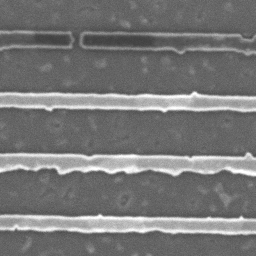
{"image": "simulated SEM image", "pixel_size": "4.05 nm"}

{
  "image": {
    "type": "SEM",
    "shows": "one or a few lines or trenches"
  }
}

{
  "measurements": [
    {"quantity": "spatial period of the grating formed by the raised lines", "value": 247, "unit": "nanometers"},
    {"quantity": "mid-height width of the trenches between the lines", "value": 192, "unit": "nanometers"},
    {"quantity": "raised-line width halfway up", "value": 54.6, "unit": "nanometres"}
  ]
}